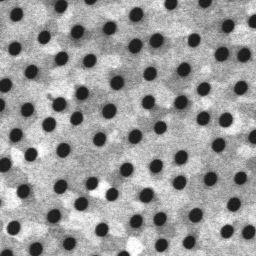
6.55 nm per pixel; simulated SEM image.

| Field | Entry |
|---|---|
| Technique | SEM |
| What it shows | a regular array of holes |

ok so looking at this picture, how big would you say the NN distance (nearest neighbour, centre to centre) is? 0.178 micrometres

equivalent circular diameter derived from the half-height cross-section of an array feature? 89 nanometers